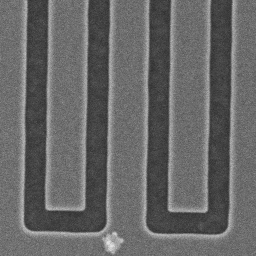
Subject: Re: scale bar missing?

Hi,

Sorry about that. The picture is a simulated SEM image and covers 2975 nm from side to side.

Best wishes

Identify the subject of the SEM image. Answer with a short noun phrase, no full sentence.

groups of lines, slits or small figures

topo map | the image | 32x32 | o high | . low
ooo...ooooo...ooooo..ooooo...ooo
ooo...ooooo...ooooo..ooooo...ooo
ooo...ooooo...ooooo..ooooo...ooo
ooo...ooooo...ooooo..ooooo...ooo
ooo...ooooo...ooooo..ooooo...ooo
ooo...ooooo...ooooo..ooooo...ooo
ooo...ooooo...ooooo..ooooo...ooo
ooo...ooooo...ooooo..ooooo...ooo
ooo...ooooo...oooo...ooooo...ooo
ooo...ooooo...oooo...ooooo...ooo
ooo...ooooo...oooo...ooooo...ooo
ooo...ooooo...oooo...ooooo...ooo
ooo...ooooo...oooo...ooooo...ooo
ooo...ooooo...oooo...ooooo...ooo
ooo...ooooo...oooo...ooooo...ooo
ooo...ooooo...oooo...ooooo...ooo
ooo...ooooo...oooo...ooooo...ooo
ooo...ooooo...oooo...ooooo...ooo
ooo...ooooo...oooo...ooooo...ooo
ooo...ooooo..ooooo...ooooo...ooo
ooo...ooooo..ooooo...ooooo...ooo
ooo...ooooo..ooooo...ooooo...ooo
ooo...ooooo..ooooo...ooooo...ooo
ooo...ooooo..ooooo...ooooo...ooo
ooo...ooooo..ooooo...ooooo...ooo
ooo...ooooo..ooooo...ooooo...ooo
ooo..........ooooo...........ooo
ooo..........ooooo...........ooo
ooo..........ooooo..........oooo
oooooooooooooooooooooooooooooooo
oooooooooooooooooooooooooooooooo
oooooooooooooooooooooooooooooooo